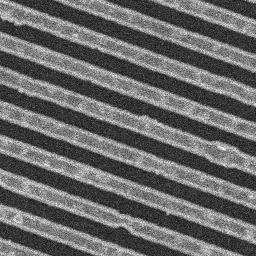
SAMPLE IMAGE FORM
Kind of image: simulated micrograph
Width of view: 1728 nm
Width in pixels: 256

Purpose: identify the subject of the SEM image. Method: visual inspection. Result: parallel lines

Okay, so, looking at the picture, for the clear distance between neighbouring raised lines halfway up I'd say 122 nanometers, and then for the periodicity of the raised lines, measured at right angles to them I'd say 0.218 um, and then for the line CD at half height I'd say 13.8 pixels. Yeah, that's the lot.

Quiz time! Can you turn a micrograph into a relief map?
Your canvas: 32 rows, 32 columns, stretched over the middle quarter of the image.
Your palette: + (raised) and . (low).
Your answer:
++++++...............++++++++++.
+++++++++..............+++++++++
..++++++++++..............++++++
.....++++++++++..............+++
........++++++++++..............
..........+++++++++++...........
.............+++++++++++........
++..............+++++++++++.....
+++++..............++++++++++...
++++++++.............+++++++++++
.++++++++++.............++++++++
...+++++++++++.............+++++
......++++++++++..............++
.........++++++++++++...........
............+++++++++++.........
+..............++++++++++.......
++++..............++++++++++....
+++++++.............+++++++++++.
+++++++++..............+++++++++
..++++++++++..............++++++
....+++++++++++..............+++
.......+++++++++++.............+
..........++++++++++............
.............++++++++++.........
++..............++++++++++......
+++++.............+++++++++++...
++++++++.............++++++++++.
++++++++++...............+++++++
...++++++++++..............+++++
......++++++++++..............++
.........++++++++++.............
............++++++++++..........